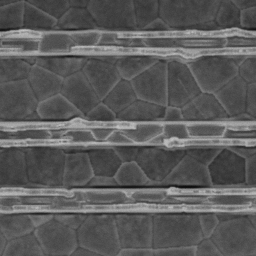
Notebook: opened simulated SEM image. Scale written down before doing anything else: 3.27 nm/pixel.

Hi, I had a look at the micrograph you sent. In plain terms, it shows one or a few lines or trenches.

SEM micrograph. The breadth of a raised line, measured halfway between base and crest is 75.9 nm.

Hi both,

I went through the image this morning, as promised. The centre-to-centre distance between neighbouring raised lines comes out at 257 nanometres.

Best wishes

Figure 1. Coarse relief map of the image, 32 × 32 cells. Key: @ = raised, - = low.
--------------------------------
--------------------------------
--------------------------------
--------------------------------
@@@@@@@@@@@@@@@@@@@@@@@@@@@@@@@@
@@@@@@@@@@@@@@@@@@@@@@@@@@@@@@@@
@@@@@@@@@@@@@@@@@@@@@@@@@@@@@@@@
--------------------------------
--------------------------------
--------------------------------
--------------------------------
--------------------------------
--------------------------------
--------------------------------
--------------------------------
@@@@@@@@@@@@@@@@@@@@@@@@@@@@@@@@
@@@@@@@@@@@@@@@@@@@@@@@@@@@@@@@@
@@@@@@@@@@@@@@@@@@@@@@@@@@@@@@@@
--------------------------------
--------------------------------
--------------------------------
--------------------------------
--------------------------------
@@@------------------@----------
@@@@@@@@@@@@@@@@@@@@@@@@@@@@@@@@
@@@@@@@@@@@@@@@@@@@@@@@@@@@@@@@@
@@------------------------------
--------------------------------
--------------------------------
--------------------------------
--------------------------------
--------------------------------